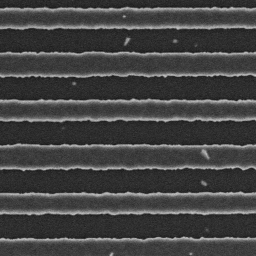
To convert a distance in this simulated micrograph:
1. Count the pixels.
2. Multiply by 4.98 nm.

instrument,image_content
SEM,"lines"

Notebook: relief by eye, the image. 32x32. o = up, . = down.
................................
oooooooooooooooooooooooooooooooo
oooooooooooooooooooooooooooooooo
ooooooo.ooooooooooooo.ooooo.o.oo
................................
................................
................................
oooooooooooooooooooooooooooooooo
oooooooooooooooooooooooooooooooo
oooooooooooooo.o.oooo.ooooo.oo..
................................
................................
................o...............
oooooooooooooooooooooooooooooooo
oooooooooooooooooooooooooooooooo
................................
................................
................................
oooooooooooooooooooooooooooooooo
oooooooooooooooooooooooooooooooo
oooooooooooooooooooooooooooooooo
................................
................................
................................
oooooooooooooooooooooooooooooooo
oooooooooooooooooooooooooooooooo
oooooooooooooooooooooooooooooooo
................................
................................
................................
oooooooooooooooooooooooooooooooo
oooooooooooooooooooooooooooooooo